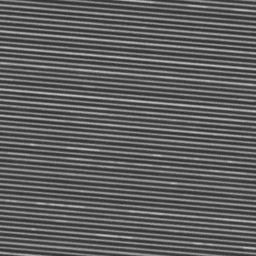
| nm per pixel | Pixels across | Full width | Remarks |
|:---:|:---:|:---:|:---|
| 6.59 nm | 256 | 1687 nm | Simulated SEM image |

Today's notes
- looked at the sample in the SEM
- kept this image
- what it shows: parallel lines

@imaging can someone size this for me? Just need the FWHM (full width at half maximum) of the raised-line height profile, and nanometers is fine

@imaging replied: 12.3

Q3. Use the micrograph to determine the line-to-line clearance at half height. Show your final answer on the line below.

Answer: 0.0247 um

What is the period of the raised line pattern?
34.6 nm